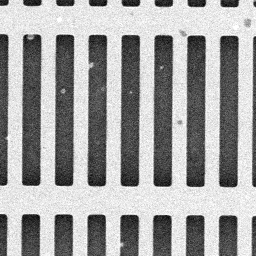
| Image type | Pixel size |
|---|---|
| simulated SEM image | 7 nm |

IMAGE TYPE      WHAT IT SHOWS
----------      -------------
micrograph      groups of lines, slits or small figures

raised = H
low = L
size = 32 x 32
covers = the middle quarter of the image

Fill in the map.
LLLHHHLLLLLHHHLLLLLHHHLLLLLHHHHL
LLLHHHLLLLLHHHLLLLLHHHLLLLLHHHHL
LLLHHHLLLLLHHHLLLLLHHHLLLLLHHHHL
LLLHHHLLLLLHHHLLLLLHHHLLLLLHHHHL
LLLHHHLLLLLHHHLLLLLHHHLLLLLHHHHL
LLLHHHLLLLLHHHLLLLLHHHLLLLLHHHHL
LLLHHHLLLLLHHHLLLLLHHHLLLLLHHHHL
LLLHHHLLLLLHHHLLLLLHHHLLLLLHHHHL
LLLHHHLLLLLHHHLLLLLHHHLLLLLHHHHL
LLLHHHLLLLLHHHLLLLLHHHLLLLLHHHHL
LLLHHHLLLLLHHHLLLLLHHHLLLLLHHHHL
LLLHHHLLLLLHHHLLLLLHHHLLLLLHHHHL
LLLHHHLLLLLHHHLLLLLHHHLLLLLHHHHL
LLLHHHLLLLLHHHLLLLLHHHLLLLLHHHHL
LLLHHHLLLLLHHHLLLLLHHHLLLLLHHHHL
LLLHHHLLLLLHHHLLLLLHHHLLLLLHHHHL
LLLHHHLLLLLHHHLLLLLHHHLLLLLHHHHL
LLLHHHLLLLLHHHLLLLLHHHLLLLLHHHHL
LLLHHHLLLLLHHHLLLLLHHHLLLLLHHHHL
LLLHHHLLLLLHHHLLLLLHHHLLLLLHHHHL
LLLHHHLLLLLHHHLLLLLHHHLLLLLHHHLL
LLLHHHLLLLLHHHLLLLLHHHLLLLLHHHLL
LLLHHHLLLLLHHHLLLLLHHHLLLLLHHHLL
LLLHHHLLLLLHHHLLLLLHHHLLLLLHHHLL
LLLHHHLLLLLHHHLLLLLHHHLLLLLHHHLL
LLLHHHLLLLLHHHLLLLLHHHLLLLLHHHLL
LLLHHHLLLLLHHHLLLLLHHHLLLLLHHHLL
LLLHHHLLLLLHHHLLLLLHHHLLLLLHHHLL
LLLHHHLLLLLHHHLLLLLHHHLLLLLHHHLL
LLLHHHLLLLLHHHLLLLLHHHLLLLLHHHLL
LLHHHHLLLLHHHHLLLLLHHHHLLLLHHHHL
HHHHHHHHHHHHHHHHHHHHHHHHHHHHHHHH